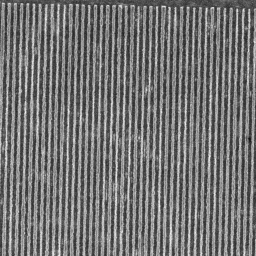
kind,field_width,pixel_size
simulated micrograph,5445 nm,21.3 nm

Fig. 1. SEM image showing parallel lines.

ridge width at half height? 37.2 nm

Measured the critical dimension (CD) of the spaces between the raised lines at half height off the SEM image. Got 98.3 nanometers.